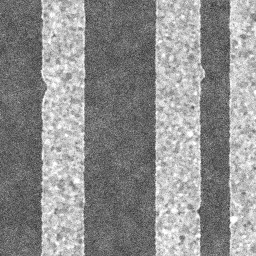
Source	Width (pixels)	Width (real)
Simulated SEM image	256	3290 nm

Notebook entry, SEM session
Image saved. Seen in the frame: one or a few lines or trenches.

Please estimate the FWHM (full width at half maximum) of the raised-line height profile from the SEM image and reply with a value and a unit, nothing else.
540 nm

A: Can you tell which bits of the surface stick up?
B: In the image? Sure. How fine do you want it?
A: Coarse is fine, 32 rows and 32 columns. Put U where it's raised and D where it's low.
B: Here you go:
DDDDDUUUUUDDDDDDDDDDUUUUUDDDDUUU
DDDDDUUUUUUDDDDDDDDDUUUUUDDDDUUU
DDDDDUUUUUUDDDDDDDDDUUUUUDDDDUUU
DDDDDUUUUUUDDDDDDDDDUUUUUDDDDUUU
DDDDDUUUUUUDDDDDDDDDUUUUUDDDDUUU
DDDDDUUUUUDDDDDDDDDDUUUUUDDDDUUU
DDDDDUUUUUDDDDDDDDDDUUUUUDDDDUUU
DDDDDUUUUUDDDDDDDDDDUUUUUDDDDUUU
DDDDDUUUUUUDDDDDDDDDUUUUUDDDDUUU
DDDDDUUUUUUDDDDDDDDDUUUUUDDDDUUU
DDDDDDUUUUUDDDDDDDDDUUUUUDDDDUUU
DDDDDDUUUUDDDDDDDDDDUUUUUDDDDUUU
DDDDDUUUUUDDDDDDDDDDUUUUUDDDDUUU
DDDDDUUUUUDDDDDDDDDDUUUUUDDDDUUU
DDDDDUUUUUDDDDDDDDDDUUUUUDDDDUUU
DDDDDUUUUUDDDDDDDDDDUUUUUDDDDUUU
DDDDDUUUUUDDDDDDDDDDUUUUUDDDDUUU
DDDDDUUUUUDDDDDDDDDDUUUUUDDDDUUU
DDDDDUUUUUDDDDDDDDDUUUUUUDDDDUUU
DDDDDUUUUUDDDDDDDDDDUUUUUDDDDUUU
DDDDDUUUUUDDDDDDDDDDUUUUUDDDDUUU
DDDDDUUUUUDDDDDDDDDDUUUUUDDDDUUU
DDDDDUUUUUDDDDDDDDDDUUUUUDDDDUUU
DDDDDUUUUUDDDDDDDDDDUUUUUDDDDUUU
DDDDDUUUUUDDDDDDDDDUUUUUUDDDDUUU
DDDDDUUUUUDDDDDDDDDUUUUUUDDDDUUU
DDDDDUUUUUDDDDDDDDDDUUUUUDDDDUUU
DDDDDUUUUUDDDDDDDDDDUUUUUDDDDUUU
DDDDDUUUUUDDDDDDDDDUUUUUUDDDDUUU
DDDDDUUUUUDDDDDDDDDUUUUUUDDDDUUU
DDDDDUUUUUDDDDDDDDDDUUUUUDDDDUUU
DDDDDUUUUUDDDDDDDDDDUUUUUDDDDUUU